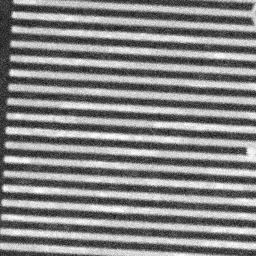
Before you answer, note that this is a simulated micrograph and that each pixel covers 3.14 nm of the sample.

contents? parallel lines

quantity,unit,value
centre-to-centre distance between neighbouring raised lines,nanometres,45.5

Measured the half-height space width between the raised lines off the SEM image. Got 0.0275 µm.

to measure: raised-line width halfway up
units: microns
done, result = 0.0184